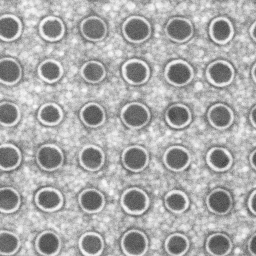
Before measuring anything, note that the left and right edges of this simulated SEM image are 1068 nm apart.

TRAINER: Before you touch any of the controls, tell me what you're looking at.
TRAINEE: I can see a regular array of raised bodies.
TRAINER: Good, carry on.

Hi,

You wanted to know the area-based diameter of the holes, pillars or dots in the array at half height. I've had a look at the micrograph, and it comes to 104 nm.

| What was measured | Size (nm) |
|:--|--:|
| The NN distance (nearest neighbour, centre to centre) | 176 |